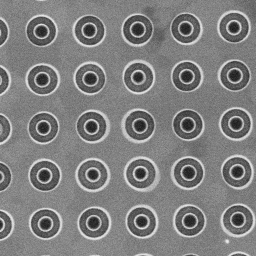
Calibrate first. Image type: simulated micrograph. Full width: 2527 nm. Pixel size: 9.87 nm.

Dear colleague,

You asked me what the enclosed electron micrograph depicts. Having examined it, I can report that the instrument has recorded an array of small figures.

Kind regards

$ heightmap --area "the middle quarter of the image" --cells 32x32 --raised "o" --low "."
oooo.....ooooooo.....ooooooo....
ooo.......ooooo.......ooooo.....
ooo..ooo..ooooo..ooo..ooooo..ooo
oo...oooo.ooooo..ooo...oooo..ooo
ooo..ooo..ooooo..ooo..ooooo...oo
ooo...o...oooooo......oooooo....
oooo.....ooooooo.....oooooooo...
oooooo.ooooooooooooooooooooooooo
oooooooooooooooooooooooooooooooo
oooooooooooooooooooooooooooooooo
oooooooooooooooooooooooooooooooo
oooooooooooooooooo.ooooooooooo..
ooooo.....oooooo.....ooooooo....
oooo......ooooo.......oooooo..oo
ooo...oo...oooo..ooo...oooo..ooo
ooo..oooo..oooo..oooo..oooo..ooo
ooo..oooo..oooo..ooo..ooooo...oo
oooo.......oooo.......oooooo....
oooo......oooooo.....oooooooo...
oooooo..oooooooooo.ooooooooooooo
oooooooooooooooooooooooooooooooo
oooooooooooooooooooooooooooooooo
oooooooooooooooooooooooooooooooo
oooooooooooooooooo..oooooooooo..
ooooo....oooooooo.....oooooo....
oooo......oooooo.......oooo...oo
ooo...oo...oooo...oo...oooo..ooo
ooo...ooo..oooo..oooo...ooo..ooo
ooo...ooo..oooo...oo...oooo...oo
oooo.......ooooo.......ooooo....
oooo......ooooooo.....ooooooo...
oooooo...oooooooooo.oooooooooooo